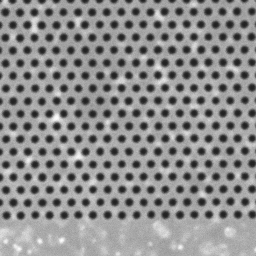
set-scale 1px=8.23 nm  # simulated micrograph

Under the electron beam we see a regular array of holes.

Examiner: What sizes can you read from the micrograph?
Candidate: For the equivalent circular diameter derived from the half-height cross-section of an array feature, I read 71.9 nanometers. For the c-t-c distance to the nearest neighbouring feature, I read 0.116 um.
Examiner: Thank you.